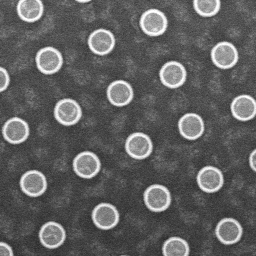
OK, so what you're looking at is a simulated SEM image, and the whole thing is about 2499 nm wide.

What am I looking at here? a regular array of raised bodies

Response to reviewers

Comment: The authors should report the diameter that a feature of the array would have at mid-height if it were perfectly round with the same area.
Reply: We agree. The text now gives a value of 238 nm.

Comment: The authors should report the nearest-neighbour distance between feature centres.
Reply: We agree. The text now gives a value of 536 nm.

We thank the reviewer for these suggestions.